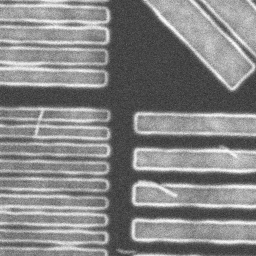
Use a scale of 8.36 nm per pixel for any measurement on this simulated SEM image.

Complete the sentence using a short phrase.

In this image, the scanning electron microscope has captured groups of lines, slits or small figures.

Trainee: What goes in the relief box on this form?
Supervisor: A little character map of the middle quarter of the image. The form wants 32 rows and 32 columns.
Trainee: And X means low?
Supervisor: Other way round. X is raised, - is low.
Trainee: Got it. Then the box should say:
XXXXXXXXXXXXXXXXXXXXXXXXXXXXXXXX
XXXXXXXXXXXXXXXXXXXXXXXXXXXXXXXX
----------XXXXXXXXXXXXXXXXXXXXXX
----------XXXXXXXXXXXXXXXXXXXXXX
----------XXXXXXXXXXXXXXXXXXXXXX
XXXXXXXXXXXXXXXXXXXXXXXXXXXXXXXX
XXXXXXXXXXXXXXXXXXXXXXXXXXXXXXXX
XXXXXXXXXXXXXXXXXXXXXXXXXXXXXXXX
XXXXXXXXXXXXXXXXXXXXXXXXXXXXXXXX
XXXXXXXXXXXXXXXXXXXXXXXXXXXXXXXX
XXXXXXXXXXXXXXXXXXXXXXXXXXXXXXXX
------XXXXXXXXXXXXXXXXXXXXXXXXXX
-----------XXXXXXXX----XX-XXXXXX
-----------XXXXXXX--------------
XXXXXXXXXXXXXXXXXX--------------
XXXXXXXXXXXXXXXXXX--------------
-----------XXXXXXX--------------
-----------XXXXXXXXXXXXXXXXXXXXX
XXXXX-----XXXXXXXXXXXXXXXXXXXXXX
XXXXXXXXXXXXXXXXXXXXXXXXXXXXXXXX
----------XXXXXXXXXXXXXXXXXXXXXX
-----------XXXXXXXX----XXXXXXXXX
-----------XXXXXXX--------------
XXXXXXXXXXXXXXXXXX--------------
XXXXXXXXXXXXXXXXXX--------------
-----------XXXXXXX--------------
-----------XXXXXXXXXXXXXXXXXXXXX
XXXXXXXXXXXXXXXXXXXXXXXXXXXXXXXX
XXXXXXXXXXXXXXXXXXXXXXXXXXXXXXXX
----------XXXXXXXXXXXXXXXXXXXXXX
-----------XXXXXXX----XXX---X-XX
XXXXXXXX--XXXXXXXX--------------